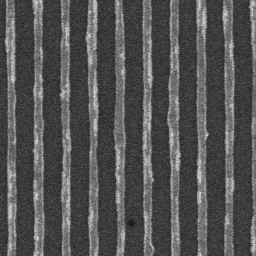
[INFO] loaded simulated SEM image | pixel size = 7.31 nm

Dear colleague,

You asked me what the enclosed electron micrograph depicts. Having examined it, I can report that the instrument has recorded parallel lines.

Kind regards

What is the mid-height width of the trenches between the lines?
144 nm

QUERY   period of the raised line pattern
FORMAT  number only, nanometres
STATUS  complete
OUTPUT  199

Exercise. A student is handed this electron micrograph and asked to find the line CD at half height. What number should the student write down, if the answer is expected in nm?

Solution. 53